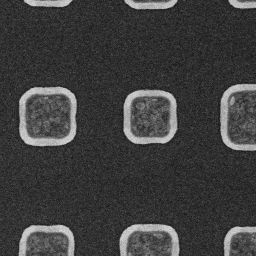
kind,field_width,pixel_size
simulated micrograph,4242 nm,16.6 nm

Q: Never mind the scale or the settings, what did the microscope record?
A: raised bodies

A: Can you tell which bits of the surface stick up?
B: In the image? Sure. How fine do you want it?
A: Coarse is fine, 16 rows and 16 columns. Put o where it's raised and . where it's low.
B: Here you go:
................
................
................
................
................
...............o
.oooo...ooo...oo
.oooo...ooo...oo
..oo....ooo...oo
................
................
................
................
................
..oo....ooo....o
.ooo....ooo...oo